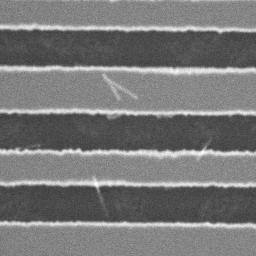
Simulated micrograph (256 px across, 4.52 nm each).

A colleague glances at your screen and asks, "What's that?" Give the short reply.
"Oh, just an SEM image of lines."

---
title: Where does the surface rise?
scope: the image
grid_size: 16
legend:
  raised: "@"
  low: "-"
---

@@@@@@@@@@@@@@@@
@@@@@@@@@@@@@@@@
----------------
----------------
@@@@@@@@@@@@@@@@
@@@@@@@@@@@@@@@@
@@@@@@@@@@@@@@@@
----------------
----------------
@@@@@@@@@@@@@@@@
@@@@@@@@@@@@@@@@
@@@@@@@@@@@@@@@@
----------------
----------------
@@@@@@@@@@@@@@@@
@@@@@@@@@@@@@@@@